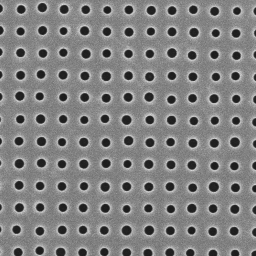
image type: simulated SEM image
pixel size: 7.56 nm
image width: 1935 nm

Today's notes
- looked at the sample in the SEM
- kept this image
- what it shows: a regular array of holes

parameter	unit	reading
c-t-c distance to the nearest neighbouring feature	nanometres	159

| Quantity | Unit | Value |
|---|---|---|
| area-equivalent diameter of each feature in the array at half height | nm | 66.1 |